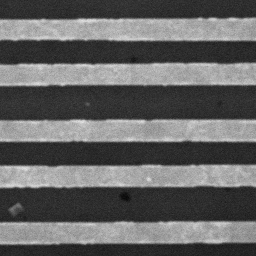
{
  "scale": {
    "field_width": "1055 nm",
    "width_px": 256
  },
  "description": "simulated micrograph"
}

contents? lines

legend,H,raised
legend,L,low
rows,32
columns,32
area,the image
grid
LLLLLLLLLLLLLLLLLLLLLLLLLLLLLLLL
LLLLLLLLLLLLLLLLLLLLLLLLLLLLLLLL
LLLLLHLLLHHHHHHHHHHHHHHHHHHHHHHH
HHHHHHHHHHHHHHHHHHHHHHHHHHHHHHHH
HHHHHHHHHHHHHHHHHHHHHHHHHHHHHHHH
LLLLLLLLLLLLLLLLLLLLLLLLLLLLLLLL
LLLLLLLLLLLLLLLLLLLLLLLLLLLLLLLL
LLLLLLLLLLLLLLLLLLLLLLLLLLLLLLLL
HHHHHHHHHHHHHHHHHHHHHHHHHHHHHHHH
HHHHHHHHHHHHHHHHHHHHHHHHHHHHHHHH
HHHHHHHHHHHHHHHHHHHHHHHHHHHHHHHH
LLLLLLLLLLLLLLLLLLLLLLLLLLLLLLLL
LLLLLLLLLLLLLLLLLLLLLLLLLLLLLLLL
LLLLLLLLLLLLLLLLLLLLLLLLLLLLLLLL
LLLLLLLLLLLLLLLLLLLLLLLLLLLLLLLL
HHHHHHHHHHHHHHHHHHHHHHHHHHHHHHHH
HHHHHHHHHHHHHHHHHHHHHHHHHHHHHHHH
HHHHHHHHHHHHHHHHHHHHHHHLHHHHHHHH
LLLLLLLLLLLLLLLLLLLLLLLLLLLLLLLL
LLLLLLLLLLLLLLLLLLLLLLLLLLLLLLLL
LLLLLLLLLLLLLLLLLLLLLLLLLLLLLLLL
HHHHHHHHHHHHHHHHHHHHHHHHHHHHHHHH
HHHHHHHHHHHHHHHHHHHHHHHHHHHHHHHH
LLLLLLLLLLLLLLLLLLLLLLLLLLLLLLLL
LLLLLLLLLLLLLLLLLLLLLLLLLLLLLLLL
LLLLLLLLLLLLLLLLLLLLLLLLLLLLLLLL
LLLLLLLLLLLLLLLLLLLLLLLLLLLLLLLL
LLLLLLLLLLLLLLLLLLLLLLLLLLLLLLLL
HHHHHHHHHHHHHHHHHHHHHHHHHHHHHHHH
HHHHHHHHHHHHHHHHHHHHHHHHHHHHHHHH
LLLLLLLLLLLLLLLLLLLLLLLLLLLLLLLL
LLLLLLLLLLLLLLLLLLLLLLLLLLLLLLLL